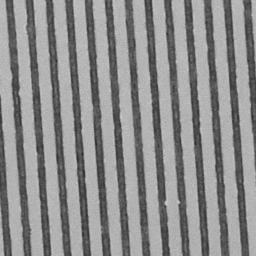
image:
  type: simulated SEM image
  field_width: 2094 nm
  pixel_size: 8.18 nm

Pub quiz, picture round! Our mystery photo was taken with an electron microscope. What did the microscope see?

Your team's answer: parallel lines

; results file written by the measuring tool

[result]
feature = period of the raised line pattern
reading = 0.161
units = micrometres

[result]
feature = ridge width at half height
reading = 0.0999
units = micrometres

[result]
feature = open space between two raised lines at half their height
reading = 64.2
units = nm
